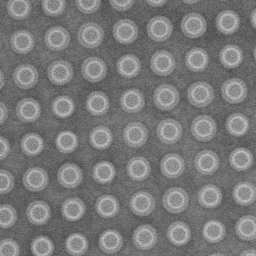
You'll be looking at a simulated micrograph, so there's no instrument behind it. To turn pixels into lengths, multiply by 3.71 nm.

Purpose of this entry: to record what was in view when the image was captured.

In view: an array of small figures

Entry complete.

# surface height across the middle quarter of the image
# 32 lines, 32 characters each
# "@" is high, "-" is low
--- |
@@--@@@@@@@--@@@@@@---@@@@@@---@
@@--@@@@@@@--@@@@@@---@@@@@-----
@@--@@@@@@----@@@@-----@@@------
@@---@@@@@----------------------
@------@------------------------
------------------------@@@-----
----------------@@-----@@@@@---@
-------@@@-----@@@@@--@@@@@@@--@
@@----@@@@@---@@@@@@--@@@@@@@--@
@@----@@@@@---@@@@@@---@@@@@@---
@@@---@@@@@---@@@@@@---@@@@@----
@@----@@@@@----@@@@-------------
@@-----@@@----------------------
--------------------------------
------------------------@@@@----
----------------@@@@---@@@@@@---
-------@@@@----@@@@@@--@@@@@@---
@@@----@@@@@---@@@@@@--@@@@@@---
@@@---@@@@@@---@@@@@@---@@@@@---
@@@---@@@@@@---@@@@@-----@@@----
@@@----@@@@------@@-------------
@@@-----------------------------
--------------------------@@----
-----------------@@@-----@@@@@--
---------@@-----@@@@@---@@@@@@--
@@@-----@@@@----@@@@@@--@@@@@@--
@@@@---@@@@@@---@@@@@@--@@@@@@--
@@@@---@@@@@@---@@@@@----@@@@---
@@@@---@@@@@-----@@@@-----@-----
@@@@----@@@---------------------
@@@-----------------------------
--------------------------@@@@--